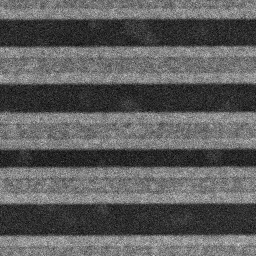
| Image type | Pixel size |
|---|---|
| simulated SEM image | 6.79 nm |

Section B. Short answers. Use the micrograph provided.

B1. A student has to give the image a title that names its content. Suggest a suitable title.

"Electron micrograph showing one or a few lines or trenches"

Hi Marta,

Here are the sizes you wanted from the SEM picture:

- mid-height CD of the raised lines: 176 nanometres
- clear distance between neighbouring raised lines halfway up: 39.2 px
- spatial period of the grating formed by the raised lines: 408 nanometres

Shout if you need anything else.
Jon